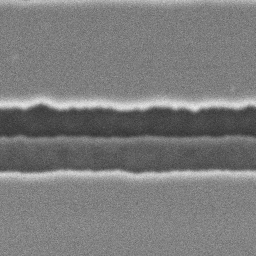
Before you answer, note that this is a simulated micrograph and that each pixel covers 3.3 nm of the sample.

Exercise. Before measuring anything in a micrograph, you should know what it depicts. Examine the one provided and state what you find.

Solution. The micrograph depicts lines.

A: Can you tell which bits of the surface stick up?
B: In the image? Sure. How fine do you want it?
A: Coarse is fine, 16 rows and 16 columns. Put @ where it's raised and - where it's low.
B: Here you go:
@@@@@@@@@@@@@@@@
@@@@@@@@@@@@@@@@
@@@@@@@@@@@@@@@@
@@@@@@@@@@@@@@@@
@@@@@@@@@@@@@@@@
@@@@@@@@@@@@@@@@
@@@@@@@@@@@@@@@@
----------------
----------------
----------------
----------------
@@@@@@@@@@@@@@@@
@@@@@@@@@@@@@@@@
@@@@@@@@@@@@@@@@
@@@@@@@@@@@@@@@@
@@@@@@@@@@@@@@@@